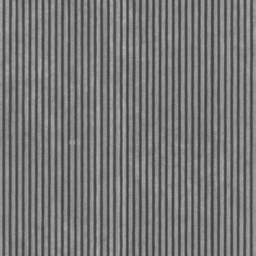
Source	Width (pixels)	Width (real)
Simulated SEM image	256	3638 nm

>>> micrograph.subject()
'parallel lines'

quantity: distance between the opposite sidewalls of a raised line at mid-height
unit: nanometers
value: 53.3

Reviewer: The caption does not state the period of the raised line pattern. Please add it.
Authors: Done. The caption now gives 92.6 nm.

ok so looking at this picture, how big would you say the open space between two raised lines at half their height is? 2.87 pixels